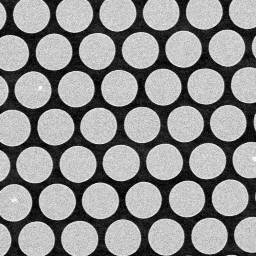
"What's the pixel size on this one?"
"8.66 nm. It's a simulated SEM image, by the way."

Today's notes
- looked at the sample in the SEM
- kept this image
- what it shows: an array of small figures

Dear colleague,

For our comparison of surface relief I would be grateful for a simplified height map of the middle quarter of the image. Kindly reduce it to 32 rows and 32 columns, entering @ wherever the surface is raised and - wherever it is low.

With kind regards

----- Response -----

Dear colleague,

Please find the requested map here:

------@@@@@------@@@@-------@@@@
-----------------------@@@------
-@@@@@-----@@@@@@-----@@@@@@----
@@@@@@@---@@@@@@@@---@@@@@@@@--@
@@@@@@@---@@@@@@@@--@@@@@@@@@--@
@@@@@@@--@@@@@@@@@--@@@@@@@@@--@
@@@@@@@--@@@@@@@@@--@@@@@@@@@--@
@@@@@@@--@@@@@@@@@---@@@@@@@@--@
@@@@@@@---@@@@@@@@---@@@@@@@----
@@@@@@-----@@@@@@-----@@@@@-----
-@@@---------@------------------
-------@@@@------@@@@@-----@@@@@
@----@@@@@@@----@@@@@@@---@@@@@@
@@---@@@@@@@@--@@@@@@@@@--@@@@@@
@@--@@@@@@@@@--@@@@@@@@@--@@@@@@
@@--@@@@@@@@@--@@@@@@@@@--@@@@@@
@@--@@@@@@@@@--@@@@@@@@@--@@@@@@
@@---@@@@@@@@---@@@@@@@----@@@@@
@@---@@@@@@@----@@@@@@@----@@@@@
-------@@@@-------@@@---------@-
------------@@@@-------@@@@-----
-@@@@@-----@@@@@@-----@@@@@@----
@@@@@@@---@@@@@@@@---@@@@@@@@---
@@@@@@@@--@@@@@@@@@--@@@@@@@@--@
@@@@@@@@--@@@@@@@@@--@@@@@@@@--@
@@@@@@@@--@@@@@@@@@--@@@@@@@@--@
@@@@@@@@--@@@@@@@@@--@@@@@@@@---
@@@@@@@----@@@@@@@----@@@@@@@---
-@@@@@@-----@@@@@------@@@@-----
---@@--------------@@---------@@
@------@@@@@-----@@@@@@-----@@@@
@@----@@@@@@@---@@@@@@@@---@@@@@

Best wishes